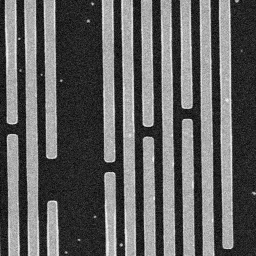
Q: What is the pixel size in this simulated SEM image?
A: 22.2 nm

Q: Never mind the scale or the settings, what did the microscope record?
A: groups of lines, slits or small figures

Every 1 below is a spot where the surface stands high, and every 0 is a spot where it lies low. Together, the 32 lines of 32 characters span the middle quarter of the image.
00000000001100011000110001100011
00000000001100011000110001100011
00000000001100011000110001100011
00000000001100011000110001100011
00000000001100011000110001100011
00000000001100011000110001100011
00000000001100011000110001100011
00000000001100011000110001100011
00000000001100011000110001100011
00000000001100011000110001100011
00000000001100011000110001100011
00000000001100011000110001100000
00000000001100011000110001100000
00000000001100011000110001100000
00000000001100011000110001100011
00000000001100011000000001100011
00000000001100011000000001100011
00000000001110011000000001100011
00000000001110011000110001100011
00000000001110011000110001100011
00000000001110011100110001100011
00000000001110011100110001100011
00000000001110011100110001100011
00000000001110011100110001100011
00000000000000011100110001100011
00000000000000011100110001100011
00000000000000011100110001100011
00000000001110011100110001100011
00000000001110011100111001100011
00000000001110011100111001100011
00000000001110011100111001100011
00000000001110011100111001100011